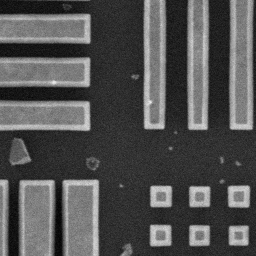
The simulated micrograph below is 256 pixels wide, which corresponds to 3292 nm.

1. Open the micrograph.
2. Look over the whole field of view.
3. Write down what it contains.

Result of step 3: groups of lines, slits or small figures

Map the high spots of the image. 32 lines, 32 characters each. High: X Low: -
------------------XX----XX---XX-
------------------XX----XX---XX-
XXXXXXXXXXX-------XX----XX---XX-
XXXXXXXXXXX-------XX----XX---XX-
XXXXXXXXXXX-------XX----XX---XX-
------------------XX----XX---XX-
------------------XX----XX---XX-
------------------XX----XX---XX-
XXXXXXXXXXX-------XX----XX---XX-
XXXXXXXXXXX-------XX----XX---XX-
XXXXXXXXXXX-------XX----XX---XX-
------------------XX----XX---XX-
------------------XX----XX---XX-
XXXXXXXXXXX-------XX----XX---XX-
XXXXXXXXXXX-------XX----XX---XX-
XXXXXXXXXXX-------XX----XX---XX-
--------------------------------
--------------------------------
--------------------------------
--------------------------------
--------------------------------
--------------------------------
--------------------------------
X--XXXX-XXXX--------------------
X--XXXX-XXXX-------XX---XX---XX-
X--XXXX-XXXX-------XX---XX---XX-
X--XXXX-XXXX--------------------
X--XXXX-XXXX--------------------
X--XXXX-XXXX-------XX-----------
X--XXXX-XXXX-------XX---XX---XX-
X--XXXX-XXXX--------------------
X--XXXX-XXXX--------------------